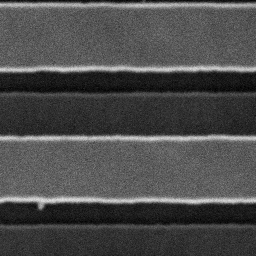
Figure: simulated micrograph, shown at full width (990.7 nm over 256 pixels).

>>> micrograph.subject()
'lines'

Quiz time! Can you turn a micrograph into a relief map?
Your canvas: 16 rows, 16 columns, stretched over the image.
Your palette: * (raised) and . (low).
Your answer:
****************
****************
****************
****************
................
................
................
................
.............**.
****************
****************
****************
****************
................
................
................